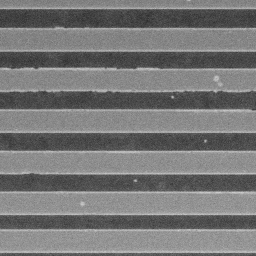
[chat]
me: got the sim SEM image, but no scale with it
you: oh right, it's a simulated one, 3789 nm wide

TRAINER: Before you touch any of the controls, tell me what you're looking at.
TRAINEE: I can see lines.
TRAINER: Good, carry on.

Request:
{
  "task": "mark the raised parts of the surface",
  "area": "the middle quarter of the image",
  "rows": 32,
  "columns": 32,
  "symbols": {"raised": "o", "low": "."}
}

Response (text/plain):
................................
oooooooooooooooooooooooooooooooo
oooooooooooooooooooooooooooooooo
oooooooooooooooooooooooooooooooo
oooooooooooooooooooooooooooooooo
oooooooooooooooooooooooooooooooo
oooooooooooooooooooooooooooooooo
................................
................................
................................
................................
................................
oooooooooooooooooooooooooooooooo
oooooooooooooooooooooooooooooooo
oooooooooooooooooooooooooooooooo
oooooooooooooooooooooooooooooooo
oooooooooooooooooooooooooooooooo
................................
................................
................................
................................
................................
oooooooooooooooooooooooooooooooo
oooooooooooooooooooooooooooooooo
oooooooooooooooooooooooooooooooo
oooooooooooooooooooooooooooooooo
oooooooooooooooooooooooooooooooo
................................
................................
................................
................................
................................